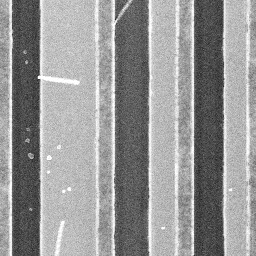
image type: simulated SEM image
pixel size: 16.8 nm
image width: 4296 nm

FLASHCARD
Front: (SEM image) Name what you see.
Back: lines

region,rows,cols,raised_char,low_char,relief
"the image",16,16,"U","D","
UDDUUUUDDUUUDDUU
UDDUUUUDDUUUDDUU
UDDUUUUDDUUUDDUU
UDDUUUUDDUUUDDUU
UDDUUUUDDUUUDDUU
UDDUUUUDDUUUDDUU
UDDUUUUDDUUUDDUU
UDDUUUUDDUUUDDUU
UDDUUUUDDUUUDDUU
UDDUUUUDDUUUDDUU
UDDUUUUDDUUUDDUU
UDDUUUUDDUUUDDUU
UDDUUUUDDUUUDDUU
UDDUUUUDDUUUDDUU
UDDUUUUDDUUUDDUU
UDDUUUUDDUUUDDUU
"